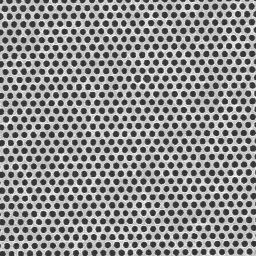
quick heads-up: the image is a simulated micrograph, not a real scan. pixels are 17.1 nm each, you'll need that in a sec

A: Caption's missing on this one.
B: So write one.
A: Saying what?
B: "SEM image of a regular array of holes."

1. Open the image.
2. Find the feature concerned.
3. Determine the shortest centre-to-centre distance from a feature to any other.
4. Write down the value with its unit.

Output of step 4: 151 nm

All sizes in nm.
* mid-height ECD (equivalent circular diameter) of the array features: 112